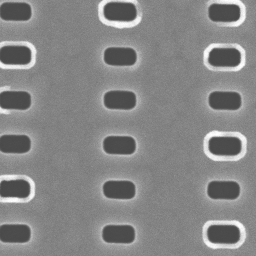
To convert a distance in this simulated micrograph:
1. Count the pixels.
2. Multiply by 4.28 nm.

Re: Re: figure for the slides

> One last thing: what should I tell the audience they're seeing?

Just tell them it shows a regular array of holes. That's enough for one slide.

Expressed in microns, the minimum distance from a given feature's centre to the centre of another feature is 0.189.